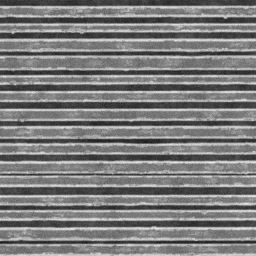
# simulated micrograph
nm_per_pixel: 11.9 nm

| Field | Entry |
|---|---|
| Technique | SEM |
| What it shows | parallel lines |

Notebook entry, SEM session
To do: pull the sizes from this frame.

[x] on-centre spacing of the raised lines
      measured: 203 nanometres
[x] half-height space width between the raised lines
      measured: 0.0831 um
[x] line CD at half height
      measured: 10.9 px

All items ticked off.